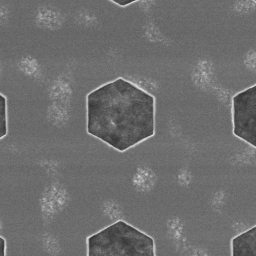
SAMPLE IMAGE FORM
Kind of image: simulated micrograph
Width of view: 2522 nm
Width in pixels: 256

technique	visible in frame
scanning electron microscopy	holes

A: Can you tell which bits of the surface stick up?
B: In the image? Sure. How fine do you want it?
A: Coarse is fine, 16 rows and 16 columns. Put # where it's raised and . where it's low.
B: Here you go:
################
################
################
################
################
######...#######
#####.....#####.
#####.....#####.
######...######.
################
################
################
################
################
######...######.
######....#####.